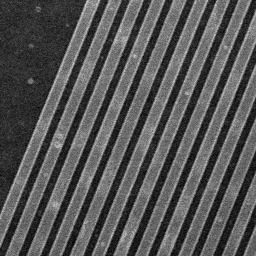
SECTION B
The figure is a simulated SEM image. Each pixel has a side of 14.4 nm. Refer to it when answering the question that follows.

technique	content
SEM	parallel lines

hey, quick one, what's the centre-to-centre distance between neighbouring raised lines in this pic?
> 288 nm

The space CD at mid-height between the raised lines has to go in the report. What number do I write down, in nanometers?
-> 122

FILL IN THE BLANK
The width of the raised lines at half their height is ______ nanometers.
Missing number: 158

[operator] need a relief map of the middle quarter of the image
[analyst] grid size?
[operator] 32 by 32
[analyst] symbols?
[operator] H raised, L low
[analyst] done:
HHLLLHHHLLHHHLLLHHLLLHHHLLHHHLLL
HHLLHHHLLLHHHLLHHHLLHHHLLLHHHLLH
HLLLHHHLLHHHLLLHHHLLHHHLLHHHLLLH
HLLLHHLLLHHHLLHHHLLLHHLLLHHHLLLH
HLLHHHLLHHHLLLHHHLLHHHLLLHHHLLHH
LLLHHLLLHHHLLHHHLLLHHHLLHHHLLLHH
LLHHHLLLHHHLLHHHLLHHHLLLHHHLLHHH
LLHHHLLHHHLLLHHHLLHHHLLHHHLLLHHH
LLHHLLLHHHLLHHHLLLHHLLLHHHLLHHHL
LHHHLLHHHHLLHHHLLHHHLLLHHHLLHHHL
LHHHLLHHHLLHHHLLLHHHLLHHHLLLHHHL
HHHLLLHHHLLHHHLLHHHLLLHHHLLHHHLL
HHHLLHHHLLLHHHLLHHHLLHHHLLLHHHLL
HHLLLHHHLLHHHLLLHHLLLHHHLLHHHLLL
HHLLHHHLLLHHHLLHHHLLLHHHLLHHHLLL
HLLLHHHLLHHHLLLHHHLLHHHLLLHHHLLH
HLLLHHHLLHHHLLHHHLLLHHHLLHHHLLLH
HLLHHHLLLHHHLLHHHLLHHHLLLHHHLLHH
LLLHHHLLHHHLLHHHLLLHHHLLHHHLLLHH
LLHHHLLLHHHLLHHHLLLHHLLLHHHLLLHH
LLHHHLLHHHLLLHHHLLHHHLLLHHHLLHHH
LLHHLLLHHHLLHHHLLLHHHLLHHHLLLHHL
LHHHLLLHHHLLHHHLLHHHLLLHHHLLHHHL
LHHHLLHHHLLHHHLLLHHHLLHHHLLLHHHL
HHHLLLHHHLLHHHLLLHHLLLHHHLLLHHLL
HHHLLHHHLLLHHHLLHHHLLLHHHLLHHHLL
HHLLLHHHLLHHHLLLHHHLLHHHLLLHHLLL
HHLLLHHHLLHHHLLHHHLLLHHHLLHHHLLL
HHLLHHHLLHHHLLLHHHLLHHHLLLHHHLLH
HLLLHHHLLHHHLLLHHLLLHHHLLHHHLLLH
HLLHHHLLLHHHLLHHHLLLHHHLLHHHLLHH
LLLHHHLLHHHLLLHHHLLHHHLLLHHLLLHH